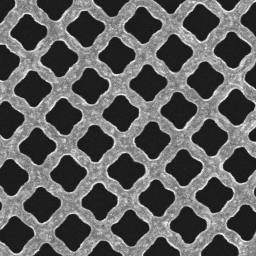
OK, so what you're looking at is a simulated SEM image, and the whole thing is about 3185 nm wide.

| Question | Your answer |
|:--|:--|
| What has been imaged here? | a regular array of holes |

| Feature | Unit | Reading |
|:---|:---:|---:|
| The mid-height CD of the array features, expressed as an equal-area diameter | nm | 404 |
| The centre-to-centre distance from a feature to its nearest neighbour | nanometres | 498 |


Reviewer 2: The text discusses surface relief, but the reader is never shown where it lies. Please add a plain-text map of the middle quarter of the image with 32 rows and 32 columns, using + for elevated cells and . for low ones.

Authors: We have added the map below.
..+++++++++.....++++..++++....++
.++++...++++...++++....++++..+++
+++++....++++.+++++.....++++++++
++++......+++++++.........+++++.
+++........++++++.........+++++.
++.........+++++..........+++++.
++.........++++++........+++++++
+++.......+++++++++....++++...++
+++++....++++...++++...++++...++
.+++++..++++....++++++++++......
..+++++++++......++++++++.......
....++++++.........+++++........
.....+++++.........+++++........
....++++++........+++++++.......
....+++++++......++++..++++....+
..+++++..++++....+++....+++...++
..++++...+++++..++++....++++++++
.++++......++++++++.......++++++
++++........++++++.........+++++
+++..........+++++.........+++++
+++.........++++++........++++++
++++.......++++++++......++++..+
+++++.....+++++.++++....++++....
..++++...+++++...++++..++++.....
...++++++++++.....++++++++......
....+++++++.........+++++.......
......+++++.........+++++.......
......+++++.........++++++......
.....+++++++.......+++++++++....
....++++++++++....++++..++++....
...+++++..++++...++++....+++++++
...++++....+++++++++......++++++